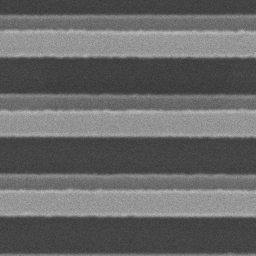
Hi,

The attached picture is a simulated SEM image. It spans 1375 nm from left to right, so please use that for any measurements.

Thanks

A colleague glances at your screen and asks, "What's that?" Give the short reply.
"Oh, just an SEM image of lines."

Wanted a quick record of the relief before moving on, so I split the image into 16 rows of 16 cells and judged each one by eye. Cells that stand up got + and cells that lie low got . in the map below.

................
++++++++++++++++
++++++++++++++++
++++++++++++++++
................
................
++++++++++++++++
++++++++++++++++
++++++++++++++++
................
................
++++++++++++++++
++++++++++++++++
+.++++++++++++++
................
................